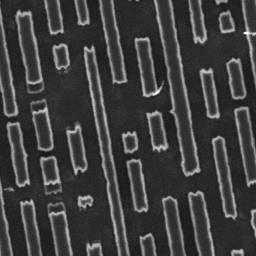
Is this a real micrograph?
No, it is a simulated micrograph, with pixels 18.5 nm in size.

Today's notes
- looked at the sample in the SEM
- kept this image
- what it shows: parallel lines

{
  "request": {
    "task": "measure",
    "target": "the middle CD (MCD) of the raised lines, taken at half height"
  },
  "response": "237 nanometres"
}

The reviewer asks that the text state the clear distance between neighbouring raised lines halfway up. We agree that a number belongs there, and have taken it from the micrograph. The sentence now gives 292 nm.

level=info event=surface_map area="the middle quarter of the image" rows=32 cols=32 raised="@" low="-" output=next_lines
@-----@@----@@@----@@@----@@@---
------@@----@@@----@@@----@@@---
------@@----@@@----@@@----@@@---
------@@@---@@@----@@@@---@@@@--
-------@@----@------@@@---@@@@--
-------@@-----------@@@----@@@--
-------@@-----------@@@@---@@@--
-------@@-----------@@@----@@@@-
-------@@------------------@@@@-
-------@@@-----------------@@@@-
-------@@@-----------------@@@@-
--------@@-----------------@@@@-
--------@@------------@@----@@@-
--------@@-----------@@@----@@@@
--------@@@----------@@@----@@@@
--------@@@-----------@@@---@@@@
---@----@@@-----------@@@----@@@
-@@@-----@@------@----@@@---@@@@
-@@@-----@@----@@@----@@@----@@@
-@@@@----@@----@@@----@@@----@@@
--@@@----@@@---@@@----@@@@---@@@
--@@@----@@@---@@@-----------@@@
--@@@----@@@-----------------@@@
--@@@-----@@------------------@@
--@@@-----@@----@@@-----------@@
---@@@----@@----@@@-----------@@
----@-----@@@---@@@-----------@@
----------@@@---@@@-----------@@
-----------@@----@@@------------
-----------@@----@@@------------
-----------@@----@@@------------
-----------@@----@@@------------